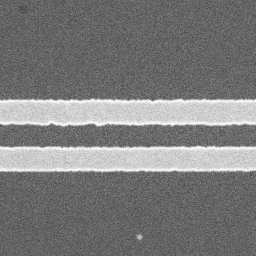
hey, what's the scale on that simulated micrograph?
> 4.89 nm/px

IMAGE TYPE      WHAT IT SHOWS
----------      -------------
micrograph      lines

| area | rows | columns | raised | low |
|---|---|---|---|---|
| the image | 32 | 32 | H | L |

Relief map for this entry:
LLLLLLLLLLLLLLLLLLLLLLLLLLLLLLLL
LLLLLLLLLLLLLLLLLLLLLLLLLLLLLLLL
LLLLLLLLLLLLLLLLLLLLLLLLLLLLLLLL
LLLLLLLLLLLLLLLLLLLLLLLLLLLLLLLL
LLLLLLLLLLLLLLLLLLLLLLLLLLLLLLLL
LLLLLLLLLLLLLLLLLLLLLLLLLLLLLLLL
LLLLLLLLLLLLLLLLLLLLLLLLLLLLLLLL
LLLLLLLLLLLLLLLLLLLLLLLLLLLLLLLL
LLLLLLLLLLLLLLLLLLLLLLLLLLLLLLLL
LLLLLLLLLLLLLLLLLLLLLLLLLLLLLLLL
LLLLLLLLLLLLLLLLLLLLLLLLLLLLLLLL
LLLLLLLLLLLLLLLLLLLLLLLLLLLLLLLL
LLLLLLLLLLLHHHLLLLLLLLHLHHLHLLHH
HHHHHHHHHHHHHHHHHHHHHHHHHHHHHHHH
HHHHHHHHHHHHHHHHHHHHHHHHHHHHHHHH
HLLLLHLHHHHLHLLHHHLLHHHHHHHHHLLH
LLLLLLLLLLLLLLLLLLLLLLLLLLLLLLLL
LLLLLLLLLLLLLLLLLLLLLLLLLLLLLLLL
HHHHHHHHHHHHHHHHHHHHHHHHHHHHHHHH
HHHHHHHHHHHHHHHHHHHHHHHHHHHHHHHH
HHHHHHHHHHHHHHHHHHHHHHHHHHHHHHHH
LLLLLLLLLLLLLLLLLLLLLLLLLLLLLLLL
LLLLLLLLLLLLLLLLLLLLLLLLLLLLLLLL
LLLLLLLLLLLLLLLLLLLLLLLLLLLLLLLL
LLLLLLLLLLLLLLLLLLLLLLLLLLLLLLLL
LLLLLLLLLLLLLLLLLLLLLLLLLLLLLLLL
LLLLLLLLLLLLLLLLLLLLLLLLLLLLLLLL
LLLLLLLLLLLLLLLLLLLLLLLLLLLLLLLL
LLLLLLLLLLLLLLLLLLLLLLLLLLLLLLLL
LLLLLLLLLLLLLLLLLLLLLLLLLLLLLLLL
LLLLLLLLLLLLLLLLLLLLLLLLLLLLLLLL
LLLLLLLLLLLLLLLLLLLLLLLLLLLLLLLL